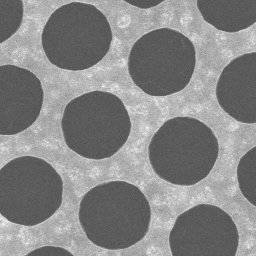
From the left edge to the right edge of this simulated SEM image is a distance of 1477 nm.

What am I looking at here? holes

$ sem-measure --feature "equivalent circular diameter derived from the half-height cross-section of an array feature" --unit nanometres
400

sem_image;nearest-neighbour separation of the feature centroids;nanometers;522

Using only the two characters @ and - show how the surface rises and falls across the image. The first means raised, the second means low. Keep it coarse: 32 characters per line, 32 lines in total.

---@@@@@---@@@@@----@@@@@-------
---@@@@------@@@@@@@@@@@@-------
---@@@-------@@@@@@@@@@@@@------
--@@@---------@@@@@@-@@@@@@----@
-@@@@---------@@@@-----@@@@@@@@@
@@@@@---------@@@-------@@@@@@@@
@@@@@@-------@@@--------@@@@@@@@
@@@@@@-------@@@--------@@@@@---
---@@@@----@@@@@--------@@@@----
-----@@@@@@@@@@@--------@@@-----
-----@@@@@@@@@@@@------@@@@-----
-----@@@@@@--@@@@@----@@@@@-----
-----@@@@------@@@@@@@@@@@@-----
-----@@@--------@@@@@@@@@@@@----
-----@@@--------@@@@@@@@@@@@@---
----@@@@--------@@@@------@@@@@@
---@@@@@--------@@@@-------@@@@@
@@@@@@@@--------@@@--------@@@@@
@@@@@@@@@------@@@@--------@@@@@
@@@-@@@@@@----@@@@@--------@@@--
@-----@@@@@@@@@@@@@--------@@@--
-------@@@@@@@@@@@@-------@@@@--
--------@@@@@@@@@@@@@----@@@@@--
--------@@@@-----@@@@@@@@@@@@@--
--------@@--------@@@@@@@@@@@@@-
--------@@---------@@@@@@-@@@@@-
-------@@@---------@@@@-----@@@@
@-----@@@@---------@@@-------@@@
@@@@@@@@@@---------@@@--------@@
@@@@@@@@@@@-------@@@---------@@
@@@@@@@@@@@@-----@@@@---------@@
@@@@-----@@@@@@@@@@@@---------@@